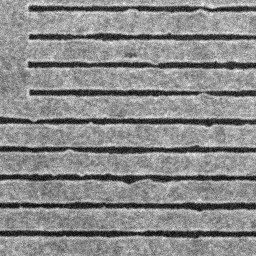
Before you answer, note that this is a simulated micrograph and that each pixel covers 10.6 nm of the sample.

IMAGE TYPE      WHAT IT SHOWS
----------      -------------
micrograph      parallel lines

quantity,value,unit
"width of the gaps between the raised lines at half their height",75.4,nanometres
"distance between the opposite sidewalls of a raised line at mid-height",220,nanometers